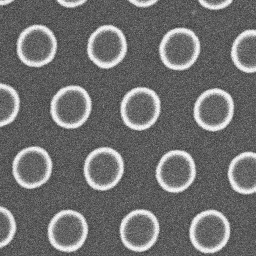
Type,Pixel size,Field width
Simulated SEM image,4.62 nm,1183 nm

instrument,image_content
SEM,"a regular array of raised bodies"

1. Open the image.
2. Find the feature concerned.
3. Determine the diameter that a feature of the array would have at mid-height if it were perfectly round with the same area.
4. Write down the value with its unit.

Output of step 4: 0.174 micrometres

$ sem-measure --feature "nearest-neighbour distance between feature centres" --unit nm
323